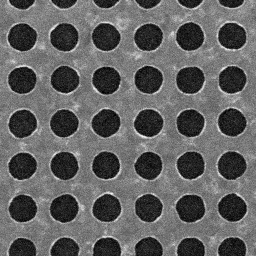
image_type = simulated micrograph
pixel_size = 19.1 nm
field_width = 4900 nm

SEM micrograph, a regular array of holes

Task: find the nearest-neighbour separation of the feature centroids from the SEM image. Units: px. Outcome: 41.8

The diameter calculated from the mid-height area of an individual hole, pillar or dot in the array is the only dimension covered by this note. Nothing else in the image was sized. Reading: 0.55 microns